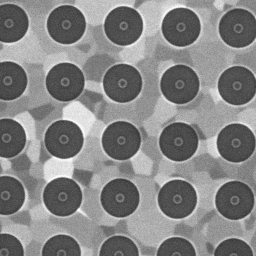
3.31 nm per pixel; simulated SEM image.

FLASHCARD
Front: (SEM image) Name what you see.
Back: an array of small figures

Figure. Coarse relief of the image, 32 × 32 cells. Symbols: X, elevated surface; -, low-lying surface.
--XXXXXXXXXXXXXXXXXXXXXXXXXXXXXX
---XXX----XXXX---XXXX---XXXX---X
----XX-----XX-----XX-----XX-----
----XX-----XX-----XX--X--XX--X--
---XXX----XXX-----XX-----XX-----
XXXXXXXX-XXXXX---XXXX---XXXX---X
XXXXXXXXXXXXXXXXXXXXXXXXXXXXXXXX
XXXXXXXXXXXXXXXXXXXXXXXXXXXXXXXX
---XXX----XXXX---XXXX---XXXXX--X
---XXX-----XX-----XX-----XX-----
---XXX-----XX--X--XX--X--XX--X--
---XXX----XXX-----XX-----XX-----
--XXXXX--XXXXX---XXXX---XXXX---X
XXXXXXXXXXXXXXXXXXXXXXXXXXXXXXXX
XXXXXXXXXXXXXXXXXXXXXXXXXXXXXXXX
---XXX----XXXX---XXXX--XXXXXX-XX
---XXX----XXX----XXX----XXX-----
---XX------XX-----XX--X--XX--X--
---XXX----XXX----XXX-----XX-----
--XXXXX--XXXXX---XXXX---XXXX---X
XXXXXXXXXXXXXXXXXXXXXXXXXXXXXXXX
XXXXXXXXXXXXXXXXXXXXXXXXXXXXXXXX
--XXXX---XXXXX--XXXXX--XXXXXXXXX
---XXX----XXX----XXX----XXX----X
X--XX--X--XXX----XXX-----XX-----
---XXX----XXX----XXX-----XX-----
--XXXX---XXXX----XXX----XXX----X
XXXXXXXXXXXXXXXXXXXXXXXXXXXXX-XX
XXXXXXXXXXXXXXXXXXXXXXXXXXXXXXXX
--XXXXX--XXXXX--XXXXXXXXXXXXXXXX
---XXX----XXX----XXX----XXX----X
X--XX--X--XX-----XXX----XXX-----